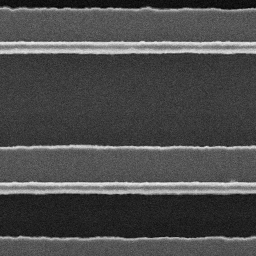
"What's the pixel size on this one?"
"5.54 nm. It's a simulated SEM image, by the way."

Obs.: lines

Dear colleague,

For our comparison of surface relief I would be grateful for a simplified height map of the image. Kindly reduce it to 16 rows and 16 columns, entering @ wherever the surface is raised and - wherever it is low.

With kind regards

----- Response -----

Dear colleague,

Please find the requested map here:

----------------
@@@@@@@@@@@@@@@@
@@@@@@@@@@@@@@@@
----------------
----------------
----------------
----------------
----------------
----------------
@@@@@@@@@@@@@@@@
@@@@@@@@@@@@@@@@
@@@@@@@@@@@@@@@@
----------------
----------------
----------------
@@@@@@@@@@@@@@@@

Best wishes